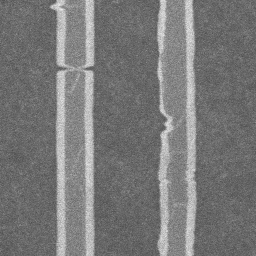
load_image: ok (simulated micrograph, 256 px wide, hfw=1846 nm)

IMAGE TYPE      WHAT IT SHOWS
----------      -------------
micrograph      one or a few lines or trenches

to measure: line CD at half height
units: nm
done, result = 200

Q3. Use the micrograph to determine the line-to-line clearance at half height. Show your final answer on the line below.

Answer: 530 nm